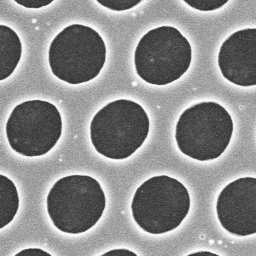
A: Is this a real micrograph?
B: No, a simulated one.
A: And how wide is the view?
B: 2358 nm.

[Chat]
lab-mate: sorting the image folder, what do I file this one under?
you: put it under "holes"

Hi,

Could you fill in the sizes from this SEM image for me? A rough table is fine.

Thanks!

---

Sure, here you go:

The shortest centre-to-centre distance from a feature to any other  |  783 nanometres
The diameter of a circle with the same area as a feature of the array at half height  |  540 nm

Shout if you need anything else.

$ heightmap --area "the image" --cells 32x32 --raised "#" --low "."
##....######.....######.....####
################################
################################
.#######...#########..##########
..#####.....######.....######...
...###.......####.......####....
...###.......####.......###.....
..####.......####.......###.....
..####.......####.......###.....
.######.....#####......#####....
#########.#########..########...
################################
####.##########.################
##.....######.....#####.....####
#.......####.......####......###
#.......###........###.......###
#.......###........###.......###
#......####.......####.......###
#......#####.....#####......####
###.#########...#######....#####
################################
################################
.######.....######....#######...
..####.......####......#####....
..####.......####.......###.....
..####.......###........###.....
..####.......###........###.....
..####......#####......####.....
#######....#######....######....
#############################..#
################################
##....#######....#######..######